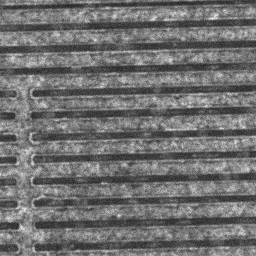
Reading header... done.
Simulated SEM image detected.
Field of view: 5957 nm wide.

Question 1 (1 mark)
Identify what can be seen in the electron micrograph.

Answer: parallel lines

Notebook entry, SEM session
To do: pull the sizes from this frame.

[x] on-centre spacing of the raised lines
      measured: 0.511 microns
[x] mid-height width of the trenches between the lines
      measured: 183 nanometers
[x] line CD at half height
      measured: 320 nanometres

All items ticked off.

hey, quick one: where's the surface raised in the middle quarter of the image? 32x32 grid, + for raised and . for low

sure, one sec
++++............................
................................
............++++++++++++++++++++
++++++++++++++++++++++++++++++++
++++++++++++++++++++++++++++++++
+++++++++++++++++++++...........
................................
................................
++++++++++++++++++++++++++++++++
++++++++++++++++++++++++++++++++
++++++++++++++++++++++++++++++++
................................
................................
..............++++++++++++++++++
++++++++++++++++++++++++++++++++
++++++++++++++++++++++++++++++++
+++++++++++++++++++++++.........
................................
................................
++++++++++++++++++++++++++++++++
++++++++++++++++++++++++++++++++
++++++++++++++++++++++++++++++++
................................
................................
................++++++++++++++++
++++++++++++++++++++++++++++++++
++++++++++++++++++++++++++++++++
++++++++++++++++++++++++........
................................
................................
++++++++++++++++++++++++++++++++
++++++++++++++++++++++++++++++++